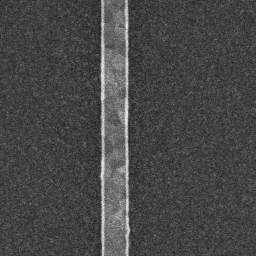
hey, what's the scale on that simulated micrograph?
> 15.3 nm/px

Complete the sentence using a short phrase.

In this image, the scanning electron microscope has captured one or a few lines or trenches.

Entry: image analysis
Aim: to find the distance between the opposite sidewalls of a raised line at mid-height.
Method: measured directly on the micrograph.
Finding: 379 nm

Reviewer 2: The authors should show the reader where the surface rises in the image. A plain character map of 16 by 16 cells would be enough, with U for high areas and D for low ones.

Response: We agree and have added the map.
DDDDDDUUDDDDDDDD
DDDDDDUUDDDDDDDD
DDDDDDUUDDDDDDDD
DDDDDDUUDDDDDDDD
DDDDDDUUDDDDDDDD
DDDDDDUUDDDDDDDD
DDDDDDUUDDDDDDDD
DDDDDDUUDDDDDDDD
DDDDDDUUDDDDDDDD
DDDDDDUUDDDDDDDD
DDDDDDUUDDDDDDDD
DDDDDDUUDDDDDDDD
DDDDDDUUDDDDDDDD
DDDDDDUUDDDDDDDD
DDDDDDUUDDDDDDDD
DDDDDDUUDDDDDDDD